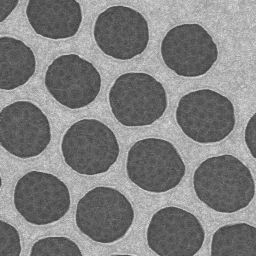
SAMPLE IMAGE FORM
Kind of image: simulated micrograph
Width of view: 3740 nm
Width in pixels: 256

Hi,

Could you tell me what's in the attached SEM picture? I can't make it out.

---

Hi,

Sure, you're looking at a regular array of holes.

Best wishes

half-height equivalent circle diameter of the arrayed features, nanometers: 825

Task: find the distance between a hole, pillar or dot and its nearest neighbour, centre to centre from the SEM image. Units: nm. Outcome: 984